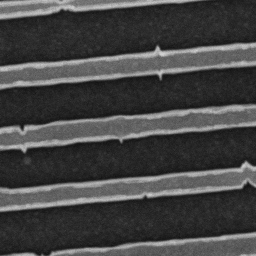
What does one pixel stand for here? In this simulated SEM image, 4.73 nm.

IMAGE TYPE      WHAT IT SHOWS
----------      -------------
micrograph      one or a few lines or trenches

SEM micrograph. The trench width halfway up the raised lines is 203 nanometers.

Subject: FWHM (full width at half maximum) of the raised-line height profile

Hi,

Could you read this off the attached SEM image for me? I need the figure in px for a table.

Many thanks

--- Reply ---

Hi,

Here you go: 19.5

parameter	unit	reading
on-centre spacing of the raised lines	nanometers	290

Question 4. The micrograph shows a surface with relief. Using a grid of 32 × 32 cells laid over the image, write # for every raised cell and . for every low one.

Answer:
##################..............
######..........................
................................
................................
................................
................................
...................#############
...........#####################
#########################.......
################................
#####...........................
................................
................................
............................####
.................###############
......##########################
#######################.........
###########.....................
###.............................
................................
..............................#.
..........................######
...............#################
.....########################...
##################..............
########........................
................................
................................
................................
.............................###
.................###############
........########################